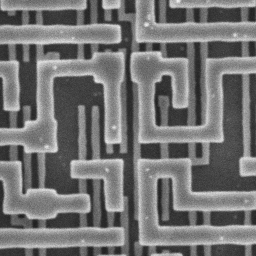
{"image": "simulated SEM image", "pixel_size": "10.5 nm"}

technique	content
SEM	wiring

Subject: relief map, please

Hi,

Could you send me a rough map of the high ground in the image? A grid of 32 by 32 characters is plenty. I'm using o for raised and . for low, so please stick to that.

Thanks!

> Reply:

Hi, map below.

ooooooooooo..oo..oo..ooooooooooo
.................oo.............
.................oo.............
ooooooooooooooo..ooooooooooooooo
ooooooooooooooo..ooooooooooooooo
................................
...................o............
...........oooo.ooooooo...oooooo
oo...oooooooooo.ooooooo...oooooo
oo...oo.....ooo.oooo.oo...oo....
oo...oo......oo..ooo.oo...oo....
oo...oo......oo..oo...o...oo....
oo...oo......oo..oo...o...oo....
.o...oo......oo..oo...o...oo....
.....oo......oo..oo.......oo....
...oooo......oo..ooo.....ooo....
ooooooo......oo..ooooooooooo....
ooooooo......oo..ooooooooooo....
...oooo.........................
................................
ooo......oooooo..ooooooo......oo
ooo......oooooo..ooooooo......oo
ooo..........oo..ooo.ooo........
ooo..........oo..ooo..oo........
.oooooooooo..oo..ooo..oooooooooo
ooooooooooo..oo..ooo..oooooooooo
.ooooooo..o......ooo............
.................ooo............
..............o..ooooooooooooooo
ooooooooooooooo..ooooooooooooooo
ooooooooooooooo...ooooooo.......
................................